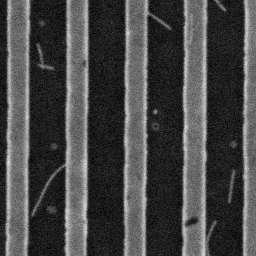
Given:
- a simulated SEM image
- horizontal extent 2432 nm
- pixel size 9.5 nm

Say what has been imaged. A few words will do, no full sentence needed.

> lines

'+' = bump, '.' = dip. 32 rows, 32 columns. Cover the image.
.+++....+++.....++.....+++.....+
.+++....+++.....++.....+++.....+
.+++....+++.....++.....+++.....+
.+++....+++.....++.....+++.....+
.+++....+++.....++.....+++.....+
.+++....+++.....++.....+++.....+
.+++....+++.....++.....+++.....+
.+++....+++.....++.....+++.....+
.+++.....++.....++.....+++.....+
.+++....+++.....++.....+++.....+
.+++....+++.....++.....+++.....+
.++......++.....++.....+++.....+
.+++....+++.....++.....+++.....+
.+++....+++.....++.....+++.....+
.+++....+++.....++.....+++.....+
.+++....+++.....++.....+++....++
.+++....+++.....++.....+++....++
.++.....+++.....++.....+++....++
.++.....+++.....++.....+++....++
.++.....+++.....++.....+++.....+
.++.....+++.....++.....+++.....+
.++.....+++.....++.....+++.....+
.++.....+++.....++.....+++.....+
.++.....+++.....++.....+++.....+
.++.....+++.....++.....++......+
.++.....+++.....++.....+++.....+
.++.....+++.....++.....+++.....+
.++.....+++.....++.....++.....++
.++.....+++.....++.....++.....++
.++.....+++.....++.....++.....++
.++.....+++.....++.....++.....++
.++.....+++.....++.....++.....++